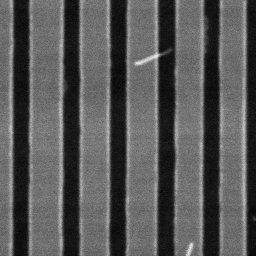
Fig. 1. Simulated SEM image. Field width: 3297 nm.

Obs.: lines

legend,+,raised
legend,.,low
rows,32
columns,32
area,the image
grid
++..++++..++++..++++..+++...+++.
++..++++..++++..++++..+++...+++.
++..++++..++++..++++..+++...+++.
++..++++..++++..++++..+++...+++.
++..++++..++++..++++..+++..++++.
++..++++..++++..++++..+++..++++.
++..++++..++++..++++..+++..++++.
++..++++..++++..++++..+++..++++.
+...++++..++++..++++..+++..++++.
+...++++..++++..++++..+++..++++.
+...++++..++++..++++..+++...+++.
+...++++..++++..++++..+++...+++.
+...++++..++++..++++..+++...+++.
+...++++..++++..++++..+++...+++.
++..++++..++++..++++..+++...+++.
+...++++..++++..++++..+++...+++.
+...++++..++++..++++..+++...+++.
++..++++..++++..++++..+++...+++.
++..++++..++++..++++..+++...+++.
+...++++..++++..++++..+++...+++.
+...++++..++++..++++..+++..++++.
+...++++..++++..++++..+++...+++.
+...++++..++++..++++..+++...+++.
+...++++..++++..++++..+++..++++.
+...++++..++++..++++..+++..++++.
+...++++..++++..++++..+++...+++.
+...++++..++++..++++..+++...+++.
+...++++..++++..++++..+++...+++.
+...++++..++++..++++..+++...+++.
+...++++..++++..++++..+++...+++.
+...++++..++++..++++..+++...+++.
+...++++..++++..++++..+++..++++.